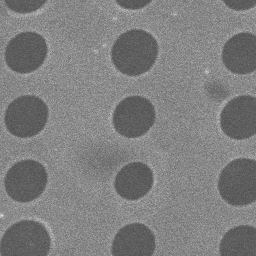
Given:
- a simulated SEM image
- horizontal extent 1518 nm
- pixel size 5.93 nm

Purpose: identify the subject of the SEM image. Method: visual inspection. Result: holes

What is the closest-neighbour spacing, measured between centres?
380 nm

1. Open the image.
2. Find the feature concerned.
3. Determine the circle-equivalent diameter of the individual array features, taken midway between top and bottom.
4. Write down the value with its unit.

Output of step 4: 0.258 microns